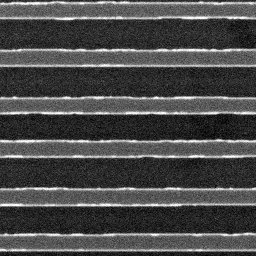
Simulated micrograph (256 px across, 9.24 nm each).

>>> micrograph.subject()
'lines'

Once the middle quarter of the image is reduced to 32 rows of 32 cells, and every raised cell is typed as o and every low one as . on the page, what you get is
................................
................................
................................
................................
................................
................................
................................
................................
oo..ooooooooooooo..o...o...ooooo
oooooooooooooooooooooooooooooooo
oooooooooooooooooooooooooooooooo
oooooooooooooooooooooooooooooooo
................................
................................
................................
................................
................................
................................
................................
oooooooooooooooooooooooooooooooo
oooooooooooooooooooooooooooooooo
oooooooooooooooooooooooooooooooo
oooooooooooooooooooooooooooooooo
................................
................................
................................
................................
................................
................................
................................
................................
oooooooooooooooooooooooooooooooo